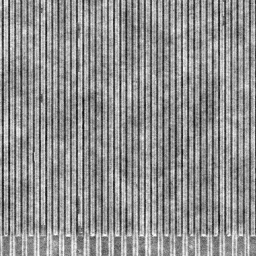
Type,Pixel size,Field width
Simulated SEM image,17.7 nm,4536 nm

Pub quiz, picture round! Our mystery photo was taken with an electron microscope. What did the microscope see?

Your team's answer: parallel lines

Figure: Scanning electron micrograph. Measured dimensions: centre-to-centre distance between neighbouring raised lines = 109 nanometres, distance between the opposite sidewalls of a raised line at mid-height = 64.2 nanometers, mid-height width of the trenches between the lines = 48.7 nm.